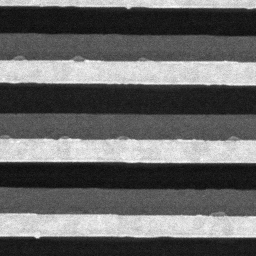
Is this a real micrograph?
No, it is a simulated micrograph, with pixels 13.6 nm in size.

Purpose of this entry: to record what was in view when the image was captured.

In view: lines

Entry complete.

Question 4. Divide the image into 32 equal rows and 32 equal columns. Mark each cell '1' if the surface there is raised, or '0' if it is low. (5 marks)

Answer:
11111111111111111111111111111111
00000000000000000000000000000000
00000000000000000000000000000000
00000000000000000000000000000000
11111111111111111111111111100000
11111111111111111111111111111111
11111111111111111111111111111111
11111111111111111111111111111111
11111111111111111111111111111111
11111111111111111111111111111111
00000000000000000000000001111111
00000000000000000000000000000000
00000000000000000000000000000000
00000000000000000000000000000000
11111111111111111111111111111111
11111111111111111111111111111111
11111111111111111111111111111111
11111111111111111111111111111111
11111111111111111111111111111111
11111111111111111111111111111111
00000000000000000000000000000000
00000000000000000000000000000000
00000000000000000000000000000000
11100000000000000000000000000000
11111111111111111111111111111111
11111111111111111111111111111111
11111111111111111111111111111111
11111111111111111111111111111111
11111111111111111111111111111111
00001010000000111111011111111111
00000000000000000000000000000000
00000000000000000000000000000000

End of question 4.